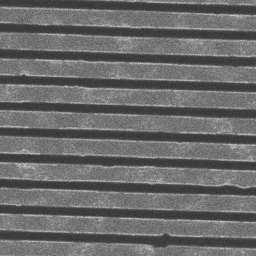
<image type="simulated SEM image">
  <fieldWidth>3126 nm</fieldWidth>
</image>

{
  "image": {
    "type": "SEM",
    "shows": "parallel lines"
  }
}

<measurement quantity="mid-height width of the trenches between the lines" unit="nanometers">102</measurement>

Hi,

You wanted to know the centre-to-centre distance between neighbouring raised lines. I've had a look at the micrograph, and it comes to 316 nm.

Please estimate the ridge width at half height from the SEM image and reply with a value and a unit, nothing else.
217 nanometres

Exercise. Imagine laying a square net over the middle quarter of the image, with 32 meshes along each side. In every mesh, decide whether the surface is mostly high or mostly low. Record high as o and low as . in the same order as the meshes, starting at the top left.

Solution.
oooooooooooooooooooooooooooooooo
oooooooooooooooooooooooooooooooo
oooooooooooooooooooooooooooooooo
....oooooooooooooooooooooooooooo
................................
o.o.............................
ooooooooooooooooooooooooo.....oo
oooooooooooooooooooooooooooooooo
oooooooooooooooooooooooooooooooo
oooooooooooooooooooooooooooooooo
..........................oooooo
................................
oooooooooooooooo................
oooooooooooooooooooooooooooooooo
oooooooooooooooooooooooooooooooo
oooooooooooooooooooooooooooooooo
..........oooooooooooooooooooooo
................................
................................
oooooooooooooooooooooooooooooo..
oooooooooooooooooooooooooooooooo
oooooooooooooooooooooooooooooooo
oooooooooooooooooooooooooooooooo
........................oooooooo
................................
oooooooooo..ooo....ooo..........
oooooooooooooooooooooooooooooooo
oooooooooooooooooooooooooooooooo
oooooooooooooooooooooooooooooooo
.........ooooooooooooooooooooooo
................................
................................